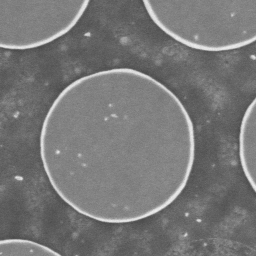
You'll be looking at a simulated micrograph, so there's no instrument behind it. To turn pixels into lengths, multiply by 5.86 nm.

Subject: raised bodies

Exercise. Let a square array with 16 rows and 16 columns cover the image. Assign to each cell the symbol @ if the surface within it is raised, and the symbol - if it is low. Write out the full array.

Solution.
@@@@@----@@@@@@@
@@@@@-----@@@@@@
@@@--------@@@@@
----------------
-------@--------
----@@@@@@------
---@@@@@@@@-----
---@@@@@@@@@---@
---@@@@@@@@@---@
---@@@@@@@@@---@
---@@@@@@@@@---@
---@@@@@@@@-----
----@@@@@@@-----
------@@@-------
----------------
@@@-------------